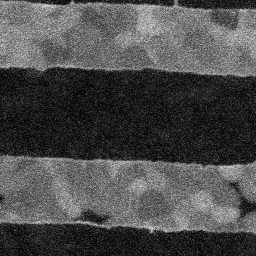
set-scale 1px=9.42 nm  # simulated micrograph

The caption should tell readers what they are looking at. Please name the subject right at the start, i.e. one or a few lines or trenches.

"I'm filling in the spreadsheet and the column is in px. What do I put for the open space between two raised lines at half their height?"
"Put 91.3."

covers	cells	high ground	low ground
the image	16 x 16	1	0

1111111111110000
1111111111111111
1111111111111111
1111111111111111
0010000000001111
0000000000000000
0000000000000000
0000000000000000
0000000000000000
0000000000000000
1111111111111111
1111111111111101
1111111111111110
1111100111111110
0000000000000010
0000000000000000